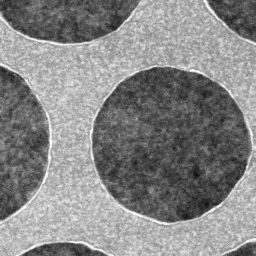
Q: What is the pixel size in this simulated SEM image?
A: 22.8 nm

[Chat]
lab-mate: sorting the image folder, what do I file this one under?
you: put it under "holes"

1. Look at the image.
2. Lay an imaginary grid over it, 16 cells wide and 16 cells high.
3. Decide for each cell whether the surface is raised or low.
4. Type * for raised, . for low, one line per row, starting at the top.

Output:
.........****...
........******..
**....*********.
****************
.********...****
..*****.......**
...***.........*
...***.........*
...***..........
...***..........
...***.........*
...***.........*
..*****.......**
.********....***
****************
**....*********.